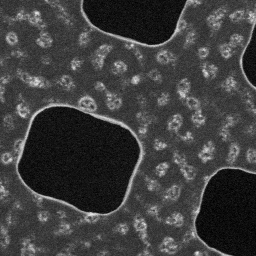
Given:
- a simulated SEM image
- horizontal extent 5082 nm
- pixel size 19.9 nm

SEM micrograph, holes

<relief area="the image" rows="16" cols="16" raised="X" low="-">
XXXXX------XXXXX
XXXXXX-----XXXXX
XXXXXXXX--XXXXXX
XXXXXXXXXXXXXXX-
XXXXXXXXXXXXXXX-
XXXXXXXXXXXXXXXX
XXXXXXXXXXXXXXXX
XX-----XXXXXXXXX
XX------XXXXXXXX
X--------XXXXXXX
X-------XXXXXXXX
XX------XXXXX---
XXXX----XXXXX---
XXXXXXXXXXXX----
XXXXXXXXXXXX----
XXXXXXXXXXXXX---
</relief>